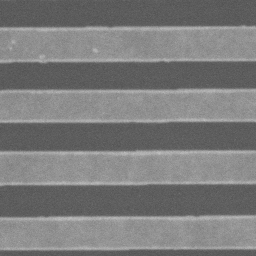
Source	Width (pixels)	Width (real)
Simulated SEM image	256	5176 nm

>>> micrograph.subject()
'lines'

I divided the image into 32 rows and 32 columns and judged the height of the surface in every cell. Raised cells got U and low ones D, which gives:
DDDDDDDDDDDDDDDDDDDDDDDDDDDDDDDD
DDDDDDDDDDDDDDDDDDDDDDDDDDDDDDDD
DDDDDDDDDDDDDDDDDDDDDDDDDDDDDDDD
DDDDDDDDDDDDDDDDDDDDDDDDUUUUUUUU
UUUUUUUUUUUUUUUUUUUUUUUUUUUUUUUU
UUUUUUUUUUUUUUUUUUUUUUUUUUUUUUUU
UUUUUUUUUUUUUUUUUUUUUUUUUUUUUUUU
UUUUUUUUUUUUUUUUUUUUUUUUUUUUUUUU
DDDDDDDDDDDDDDDDDDDDDDDDDDDDDDDD
DDDDDDDDDDDDDDDDDDDDDDDDDDDDDDDD
DDDDDDDDDDDDDDDDDDDDDDDDDDDDDDDD
UUUUUUUUUUUUUUUUUUUUUUUUUUUUUUUU
UUUUUUUUUUUUUUUUUUUUUUUUUUUUUUUU
UUUUUUUUUUUUUUUUUUUUUUUUUUUUUUUU
UUUUUUUUUUUUUUUUUUUUUUUUUUUUUUUU
DDDDDDDDDDDDDDDDDDDDDDDDDDDDDDDD
DDDDDDDDDDDDDDDDDDDDDDDDDDDDDDDD
DDDDDDDDDDDDDDDDDDDDDDDDDDDDDDDD
DDDDDDDDDDDDDDDDDDDDDDDDDDDDDDDD
UUUUUUUUUUUUUUUUUUUUUUUUUUUUUUUU
UUUUUUUUUUUUUUUUUUUUUUUUUUUUUUUU
UUUUUUUUUUUUUUUUUUUUUUUUUUUUUUUU
UUUUUUUUUUUUUUUUUUUUUUUUUUUUUUUU
DDDDDDDDDDDDDDDDDDDDDDDDDDDDDDDD
DDDDDDDDDDDDDDDDDDDDDDDDDDDDDDDD
DDDDDDDDDDDDDDDDDDDDDDDDDDDDDDDD
DDDDDDDDDDDDDDDDDDDDDDDDDDDDDDDD
UUUUUUUUUUUUUUUUUUUUUUUUUUUUUUUU
UUUUUUUUUUUUUUUUUUUUUUUUUUUUUUUU
UUUUUUUUUUUUUUUUUUUUUUUUUUUUUUUU
UUUUUUUUUUUUUUUUUUUUUUUUUUUUUUUU
DDDDDDDDDDDDDDDDDDDDDDDDDDDDDDDD